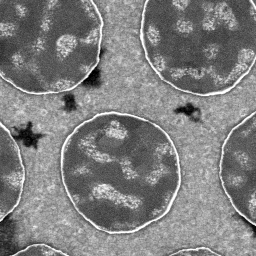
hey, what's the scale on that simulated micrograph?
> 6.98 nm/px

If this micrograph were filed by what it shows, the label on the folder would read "raised bodies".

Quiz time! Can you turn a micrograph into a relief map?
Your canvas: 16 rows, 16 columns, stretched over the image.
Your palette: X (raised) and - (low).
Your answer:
XXXXXX---XXXXXXX
XXXXXX---XXXXXXX
XXXXXX---XXXXXXX
XXXXXX---XXXXXXX
XXXXXX----XXXXX-
-XXX-------XXX--
----------------
------XXX------X
X---XXXXXX----XX
X---XXXXXXX---XX
X---XXXXXXX---XX
X---XXXXXXX---XX
X---XXXXXXX---XX
-----XXXXX-----X
-------X--------
--X-------------